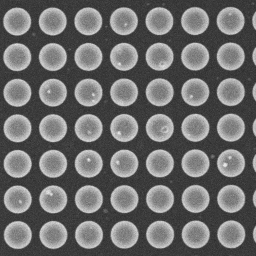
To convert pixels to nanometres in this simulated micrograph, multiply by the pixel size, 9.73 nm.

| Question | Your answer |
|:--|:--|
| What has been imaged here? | an array of small figures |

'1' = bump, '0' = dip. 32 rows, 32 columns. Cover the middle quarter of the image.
00001111100011111100011111000011
00000110000000110000000110000000
00000000000000000000000000000000
00000000000000000000000000000000
00001111000001111000001111000001
00011111100011111100011111100011
00011111100011111100011111100111
10011111100011111100011111100111
00011111100011111100011111100011
00001111100001111100001111000011
00000000000000000000000000000000
00000000000000000000000000000000
00000000000000000000000000000000
00001111100001111000001111000011
00011111100011111100011111100011
10011111100011111100011111100111
10011111100011111100011111100111
00011111100011111100011111100011
00001111100001111000001111000001
00000000000000000000000000000000
00000000000000000000000000000000
00000000000000000000000000000000
00001111100001111100001111000011
00011111100011111100011111100011
10011111100011111100011111100111
10011111100011111100011111100011
00011111100011111100011111100011
00001111000001111000001111000001
00000000000000000000000000000000
00000000000000000000000000000000
00000010000000110000000110000000
00001111100001111100011111100011